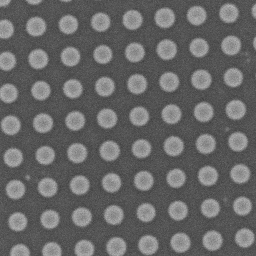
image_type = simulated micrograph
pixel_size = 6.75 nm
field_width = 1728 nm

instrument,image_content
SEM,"an array of small figures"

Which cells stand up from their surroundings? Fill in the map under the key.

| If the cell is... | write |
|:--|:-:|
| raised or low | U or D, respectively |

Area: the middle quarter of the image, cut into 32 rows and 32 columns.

DDDDDDDDDDDDDDDDDDDDDDDDDDDDDDDD
DDDDDDDDDDDDDDDDDDDDDDDDDDDDDDDD
DDDDDDDDDDDDDDDDDDDDDDDDDUUDDDDD
DDDDDDDDDDUDDDDDUUUUDDDDUUUUDDDD
DUUUDDDDUUUUDDDDUUUUUDDDUUUUUDDD
UUUUDDDDUUUUUDDDUUUUUDDDUUUUDDDD
UUUUDDDDUUUUDDDDUUUUDDDDDUUDDDDD
UUUUDDDDDUUUDDDDDDDDDDDDDDDDDDDD
DDDDDDDDDDDDDDDDDDDDDDDDDDDDDDDD
DDDDDDDDDDDDDDDDDDDDDDDDDDDDDDDD
DDDDDDDDDDDDDDDDDDDDDDDDDDUUDDDD
DDDDDDDDDDUUDDDDDUUUDDDDDUUUUDDD
DUUUDDDDDUUUUDDDDUUUUDDDDUUUUDDD
DUUUUDDDUUUUUDDDDUUUUDDDDUUUUDDD
DUUUUDDDDUUUUDDDDUUUUDDDDDUUDDDD
DUUUUDDDDUUUDDDDDDDDDDDDDDDDDDDD
DDDDDDDDDDDDDDDDDDDDDDDDDDDDDDDD
DDDDDDDDDDDDDDDDDDDDDDDDDDDDDDDD
DDDDDDDDDDDDDDDDDDDDDDDDDDUUUDDD
DDDDDDDDDDDUDDDDDDUUUDDDDUUUUDDD
DDUUUDDDDUUUUDDDDUUUUUDDDUUUUUDD
DUUUUDDDDUUUUUDDDUUUUUDDDUUUUUDD
DUUUUUDDDUUUUUDDDDUUUDDDDDUUUDDD
DUUUUDDDDDUUUDDDDDDDDDDDDDDDDDDD
DDDUDDDDDDDDDDDDDDDDDDDDDDDDDDDD
DDDDDDDDDDDDDDDDDDDDDDDDDDDDDDDD
DDDDDDDDDDDDDDDDDDDDDDDDDDDUUDDD
DDDDDDDDDDDDUDDDDDUUUDDDDDUUUUDD
DDUUUDDDDDUUUUDDDDUUUUDDDDUUUUDD
DDUUUUDDDDUUUUDDDDUUUUDDDDUUUUDD
DDUUUUDDDDUUUUDDDDUUUUDDDDDUUDDD
DDUUUUDDDDDUUDDDDDDDDDDDDDDDDDDD